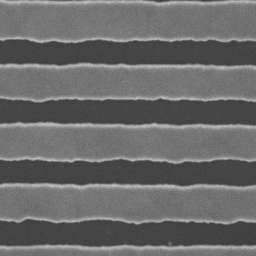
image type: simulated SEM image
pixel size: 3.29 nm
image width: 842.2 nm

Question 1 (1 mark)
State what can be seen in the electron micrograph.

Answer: lines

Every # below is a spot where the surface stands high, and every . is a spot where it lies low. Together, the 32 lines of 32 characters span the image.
################################
################################
################################
################################
################################
................................
................................
................................
################################
################################
################################
################################
...###...................##....#
................................
................................
########.###.......#............
################################
################################
################################
################################
................................
................................
................................
################################
################################
################################
################################
###.########..##################
................................
................................
................................
################################